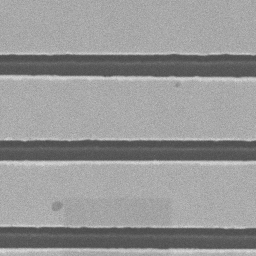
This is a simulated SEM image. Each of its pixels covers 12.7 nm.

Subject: lines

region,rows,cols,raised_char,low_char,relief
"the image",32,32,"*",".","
********************************
********************************
********************************
********************************
********************************
********************************
********************************
................................
................................
*******.........................
********************************
********************************
********************************
********************************
********************************
********************************
********************************
..**....*..................*..**
................................
................................
********************************
********************************
********************************
********************************
********************************
********************************
********************************
********************************
...........................****.
................................
................................
********************************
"